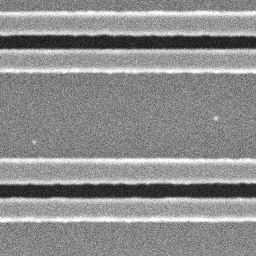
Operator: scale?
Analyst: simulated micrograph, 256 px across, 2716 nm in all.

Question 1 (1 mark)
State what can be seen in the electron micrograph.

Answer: lines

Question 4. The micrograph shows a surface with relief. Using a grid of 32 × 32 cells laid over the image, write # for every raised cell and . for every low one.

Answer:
................................
................................
################################
################################
................................
................................
################################
################################
################################
................................
................................
................................
................................
................................
................................
................................
................................
................................
................................
................................
################################
################################
################################
................................
................................
################################
################################
##########.#################.##.
................................
................................
................................
................................